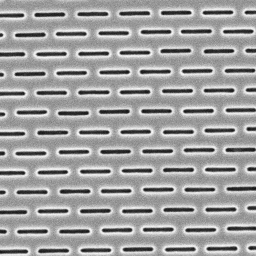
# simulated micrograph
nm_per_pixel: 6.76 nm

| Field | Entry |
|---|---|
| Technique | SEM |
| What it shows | a regular array of holes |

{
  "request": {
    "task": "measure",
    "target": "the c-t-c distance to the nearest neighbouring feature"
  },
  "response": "0.188 um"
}